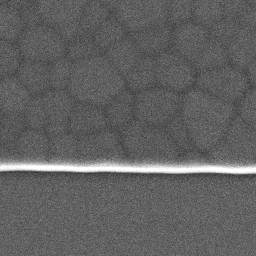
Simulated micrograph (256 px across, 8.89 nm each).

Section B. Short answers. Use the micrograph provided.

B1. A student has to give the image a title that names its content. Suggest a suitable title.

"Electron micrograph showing wiring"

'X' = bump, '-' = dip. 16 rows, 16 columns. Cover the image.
XXXXXXXXXXXXXXXX
XXXXXXXXXXXXXXXX
XXXXXXXXXXXXXXXX
XXXXXXXXXXXXXXXX
XXXXXXXXXXXXXXXX
XXXXXXXXXXXXXXXX
XXXXXXXXXXXXXXXX
XXXXXXXXXXXXXXXX
XXXXXXXXXXXXXXXX
XXXXXXXXXXXXXXXX
X-XXXXXXXXXXXXXX
----------------
----------------
----------------
----------------
----------------